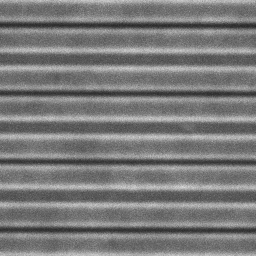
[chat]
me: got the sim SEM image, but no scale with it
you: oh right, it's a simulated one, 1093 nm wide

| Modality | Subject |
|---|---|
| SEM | parallel lines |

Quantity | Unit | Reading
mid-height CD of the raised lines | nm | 99.2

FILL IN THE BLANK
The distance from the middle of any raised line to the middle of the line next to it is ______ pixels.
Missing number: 34.9